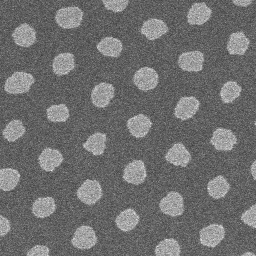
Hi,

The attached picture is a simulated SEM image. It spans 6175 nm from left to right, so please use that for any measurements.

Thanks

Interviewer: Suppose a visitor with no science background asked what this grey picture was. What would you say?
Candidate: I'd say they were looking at a regular array of raised bodies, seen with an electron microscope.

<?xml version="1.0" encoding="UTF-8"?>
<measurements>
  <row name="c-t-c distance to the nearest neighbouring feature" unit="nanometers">1130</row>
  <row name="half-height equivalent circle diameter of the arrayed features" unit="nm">523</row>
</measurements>